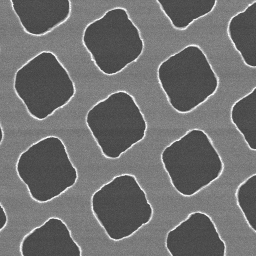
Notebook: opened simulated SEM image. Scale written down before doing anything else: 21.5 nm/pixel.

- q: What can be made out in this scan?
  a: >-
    holes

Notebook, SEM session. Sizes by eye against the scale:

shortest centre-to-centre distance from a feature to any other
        1.78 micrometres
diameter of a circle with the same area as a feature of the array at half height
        1.23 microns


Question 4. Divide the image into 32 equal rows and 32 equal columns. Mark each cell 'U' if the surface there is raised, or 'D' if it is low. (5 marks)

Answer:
UUDDDDDDDUUUUUUUUUUUDDDDDDDUUUUU
UUDDDDDDDUUUUUDDUUUUUDDDDDUUUUDD
UUUDDDDDUUUUDDDDUUUUUDDDUUUUUDDD
UUUDDDUUUUUDDDDDDUUUUUUUUUUUUDDD
UUUUUUUUUUDDDDDDDUUUUUUUUUUUUDDD
UUUUUUUUUUUDDDDDDDUUUUUUUUUUUDDD
UUUUUUUUUUUDDDDDDDUUUUDDDUUUUUDD
UUUUDDDUUUUUDDDDDUUUUDDDDDUUUUUD
UUUDDDDDUUUUDDDUUUUUDDDDDDUUUUUU
UUDDDDDDDUUUUUUUUUUUDDDDDDDUUUUU
UUDDDDDDDUUUUUUUUUUUDDDDDDDUUUUU
UUDDDDDDDUUUUUUUUUUUUDDDDDDUUUUD
UUUDDDDDDUUUUDDDDUUUUDDDDDUUUUDD
UUUDDDDUUUUUDDDDDUUUUUDDUUUUUDDD
UUUUDDUUUUUDDDDDDDUUUUUUUUUUUDDD
UUUUUUUUUUUDDDDDDDUUUUUUUUUUUDDD
UUUUUUUUUUUUDDDDDDUUUUUUDUUUUUDD
UUUUUDDUUUUUDDDDDUUUUUDDDDUUUUUD
UUUUDDDDUUUUUDDDUUUUUDDDDDDUUUUU
UUUDDDDDUUUUUDDUUUUUDDDDDDDUUUUU
UUDDDDDDDUUUUUUUUUUUUDDDDDDDUUUU
UUDDDDDDDUUUUUUUUUUUUDDDDDDDUUUU
UUUDDDDDDUUUUUDDDUUUUDDDDDDUUUUD
UUUUDDDDUUUUUDDDDDUUUUDDDUUUUUDD
UUUUDDDUUUUUDDDDDDUUUUUUUUUUUUDD
UUUUUUUUUUUUDDDDDDDUUUUUUUUUUUDD
UUUUUUUUUUUUDDDDDDDUUUUUUUUUUUDD
DUUUUUDUUUUUDDDDDDDUUUUDDDUUUUUD
UUUUUDDDUUUUUDDDDUUUUUDDDDDUUUUU
UUUUDDDDDUUUUUDDUUUUUDDDDDDUUUUU
UUUDDDDDDUUUUUUUUUUUUDDDDDDDUUUU
UUUDDDDDDDUUUUUUUUUUUDDDDDDDUUUU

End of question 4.